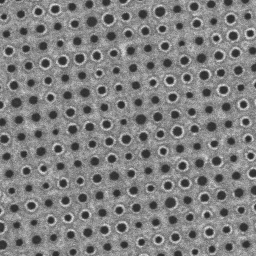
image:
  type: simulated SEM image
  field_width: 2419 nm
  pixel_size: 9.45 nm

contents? a regular array of holes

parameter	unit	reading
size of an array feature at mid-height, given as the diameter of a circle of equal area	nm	79.8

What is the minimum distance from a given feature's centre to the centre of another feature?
162 nm